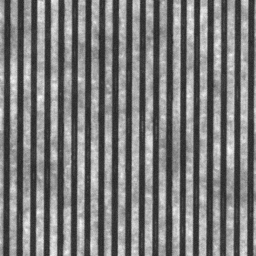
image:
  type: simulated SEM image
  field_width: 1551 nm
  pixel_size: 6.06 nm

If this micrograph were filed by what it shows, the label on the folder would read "parallel lines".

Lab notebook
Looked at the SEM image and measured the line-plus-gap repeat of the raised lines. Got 82.1 nanometers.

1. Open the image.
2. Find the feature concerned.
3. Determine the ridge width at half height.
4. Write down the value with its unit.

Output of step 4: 41.7 nm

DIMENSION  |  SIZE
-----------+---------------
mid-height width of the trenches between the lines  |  41.7 nm